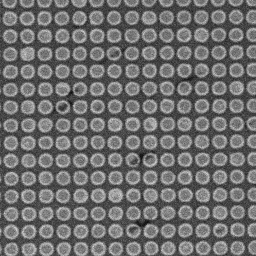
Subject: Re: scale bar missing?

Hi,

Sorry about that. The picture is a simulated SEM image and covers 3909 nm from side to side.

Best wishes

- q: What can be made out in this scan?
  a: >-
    a regular array of raised bodies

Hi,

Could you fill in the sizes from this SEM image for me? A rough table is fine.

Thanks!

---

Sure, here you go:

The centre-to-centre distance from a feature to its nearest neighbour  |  263 nm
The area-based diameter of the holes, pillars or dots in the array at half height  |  202 nm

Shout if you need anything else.